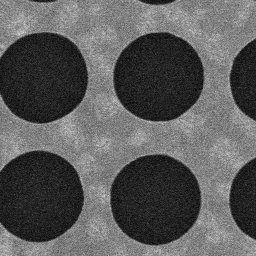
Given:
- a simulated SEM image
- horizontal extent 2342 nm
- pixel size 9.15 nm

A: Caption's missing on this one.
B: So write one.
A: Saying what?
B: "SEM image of holes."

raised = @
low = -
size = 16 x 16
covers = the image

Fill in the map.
@@@@@@@@@@@@@@@@
@@@@@@@@@@@@@@@@
@---@@@@---@@@@@
-----@@-----@@@-
-----@@------@--
-----@@------@--
-----@@@----@@@-
@@--@@@@@--@@@@@
@@@@@@@@@@@@@@@@
@@-@@@@@@@@@@@@@
-----@@@----@@@-
-----@@-----@@--
-----@@------@--
-----@@-----@@@-
@---@@@@----@@@-
@@@@@@@@@@@@@@@@